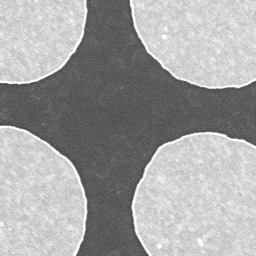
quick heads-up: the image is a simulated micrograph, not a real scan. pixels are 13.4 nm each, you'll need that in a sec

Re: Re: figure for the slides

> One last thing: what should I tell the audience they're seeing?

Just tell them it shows raised bodies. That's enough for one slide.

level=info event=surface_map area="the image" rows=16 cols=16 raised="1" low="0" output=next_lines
1111100011111111
1111100011111111
1111100001111111
1111000000111111
1110000000011111
0000000000000000
0000000000000000
0000000000000000
1100000000001100
1111000000111111
1111100001111111
1111100001111111
1111100011111111
1111100011111111
1111100001111111
1111100001111111